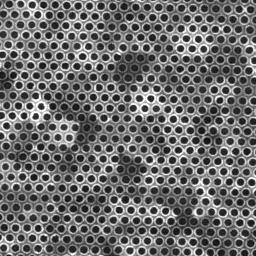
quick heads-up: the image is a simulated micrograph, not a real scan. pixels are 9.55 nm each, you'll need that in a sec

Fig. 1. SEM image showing a regular array of holes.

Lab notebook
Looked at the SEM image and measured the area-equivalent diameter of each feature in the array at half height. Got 7.91 px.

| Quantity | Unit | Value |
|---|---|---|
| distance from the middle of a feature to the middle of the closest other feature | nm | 106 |